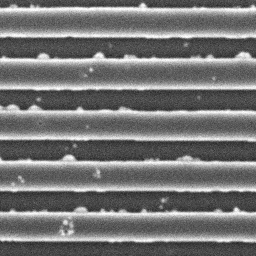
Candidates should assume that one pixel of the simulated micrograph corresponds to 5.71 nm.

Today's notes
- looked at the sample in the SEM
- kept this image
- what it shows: lines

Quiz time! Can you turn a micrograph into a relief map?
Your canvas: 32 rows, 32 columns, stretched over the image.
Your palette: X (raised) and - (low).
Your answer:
--------------------------------
XXXXXXXXXXXXXXXXXXXXXXXXXXXXXXXX
XXXXXXXXXXXXXXXXXXXXXXXXXXXXXXXX
XXXXXXXXXXXXXXXXXXXXXXXXXXXXXXXX
XXXXXXXXXXXXXXXXXXXXXXXXXXXXXXXX
--------------------------------
--------------------------------
XXXX-X----XXXXXXXXXXXXXXXXXXXXXX
XXXXXXXXXXXXXXXXXXXXXXXXXXXXXXXX
XXXXXXXXXXXXXXXXXXXXXXXXXXXXXXXX
XXXXXXXXXXXXXXXXXXXXXXXXXXXXXXXX
--------------------------------
--------------------------------
-X------------------------------
XXXXXXXXXXXXXXXXXXXXXXXXXXXXXXXX
XXXXXXXXXXXXXXXXXXXXXXXXXXXXXXXX
XXXXXXXXXXXXXXXXXXXXXXXXXXXXXXXX
-------------------------------X
--------------------------------
--------------------------------
XXXXXXXXXXXXXXXXXXXXXXXXXXXXXXXX
XXXXXXXXXXXXXXXXXXXXXXXXXXXXXXXX
XXXXXXXXXXXXXXXXXXXXXXXXXXXXXXXX
XXXXXXXXXXXXXXXXXXXXXXXXXXXXXXXX
--------------------------------
--------------------------------
----------X------------------X--
XXXXXXXXXXXXXXXXXXXXXXXXXXXXXXXX
XXXXXXXXXXXXXXXXXXXXXXXXXXXXXXXX
XXXXXXXXXXXXXXXXXXXXXXXXXXXXXXXX
--------------------------------
--------------------------------